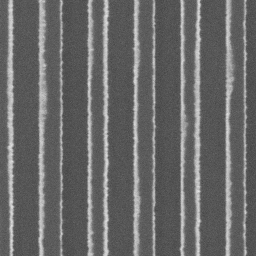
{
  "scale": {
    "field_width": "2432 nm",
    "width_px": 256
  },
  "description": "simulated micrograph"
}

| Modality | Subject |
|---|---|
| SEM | lines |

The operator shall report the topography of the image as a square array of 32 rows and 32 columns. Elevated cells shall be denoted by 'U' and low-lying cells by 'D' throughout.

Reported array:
UDDDDUUUDDDUUDDDDUUDDDDUUDDDDUUD
UDDDDUUUDDDUUDDDDUUDDDDUUDDDDUUD
UDDDDUUUDDDUUDDDDUUDDDDUUDDDDUUD
UDDDDUUUDDDUUDDDDUUDDDDUUDDDUUUD
UDDDDUUUDDDUUDDDDUUDDDDUUDDDUUUD
UDDDDUUUDDDUUDDDDUUDDDDUUDDDDUUD
UDDDDUUUDDDUUDDDDUUDDDDUUDDDDUUD
UDDDDUUUDDDUUDDDDUUDDDDUUDDDDUUD
UDDDDUUUDDDUUDDDDUUDDDDUUDDDDUUD
UDDDDUUUDDDUUDDDDUUDDDDUUDDDDUUD
UDDDDUUUDDDUUDDDDUUDDDDUUDDDDUUD
UDDDDUUUDDDUUDDDDUUDDDDUUDDDDUUD
UDDDDUUUDDDUUDDDDUUDDDDUUDDDUUUD
UDDDDUUUDDDUUDDDDUUDDDDUUDDDUUUD
UDDDDUUUDDDUUDDDDUUDDDDUUDDDUUUD
UDDDDUUUDDDUUDDDDUUDDDDUUDDDUUUD
UDDDDUUUDDDUUDDDDUUDDDDUUDDDUUUD
UDDDDUUUDDDUUDDDDUUDDDDUUDDDUUUD
UDDDDUUUDDDUUDDDDUUDDDDUUDDDUUUD
UDDDDUUUDDDUUDDDDUUDDDDUUDDDDUUD
UDDDDUUUDDDUUDDDDUUDDDDUUDDDUUUD
UDDDDUUUDDDUUDDDDUUDDDDUUDDDUUUD
UDDDDUUUDDDUUDDDDUUDDDDUUDDDUUUD
UDDDDUUUDDDUUDDDDUUDDDDUUDDDUUUD
UDDDDUUUDDDUUDDDDUUDDDDUUDDDUUUD
UUDDDUUUDDDUUDDDDUUDDDDUUDDDDUUD
UDDDDUUUDDDUUDDDDUUDDDDUUDDDDUUD
UDDDDUUUDDDUUDDDDUUDDDDUUDDDUUUD
UDDDDUUUDDDUUDDDDUUDDDDUUDDDUUUD
UDDDDUUUDDDUUDDDDUUDDDDUUDDDUUUD
UDDDDUUUDDDUUDDDDUUDDDDUUDDDUUUD
UDDDDUUUDDDUUDDDDUUDDDDUUDDDUUUD